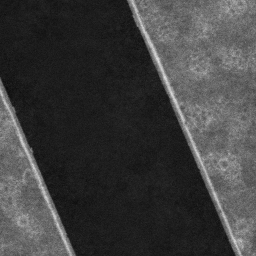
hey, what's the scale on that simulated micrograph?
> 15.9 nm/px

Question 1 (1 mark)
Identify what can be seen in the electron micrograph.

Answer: one or a few lines or trenches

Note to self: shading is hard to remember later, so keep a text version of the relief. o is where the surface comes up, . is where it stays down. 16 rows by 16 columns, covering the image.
........oooooooo
.........ooooooo
.........ooooooo
..........oooooo
..........oooooo
...........ooooo
...........ooooo
o..........ooooo
o...........oooo
oo..........oooo
oo...........ooo
ooo..........ooo
ooo...........oo
ooo...........oo
oooo..........oo
oooo...........o